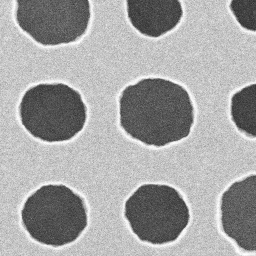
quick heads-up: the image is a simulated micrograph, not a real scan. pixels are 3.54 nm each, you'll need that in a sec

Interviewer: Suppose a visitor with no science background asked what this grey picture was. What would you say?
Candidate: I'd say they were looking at holes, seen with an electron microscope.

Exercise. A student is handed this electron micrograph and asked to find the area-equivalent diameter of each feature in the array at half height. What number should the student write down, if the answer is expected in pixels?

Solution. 63.6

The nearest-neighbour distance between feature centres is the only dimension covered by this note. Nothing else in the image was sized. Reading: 361 nm